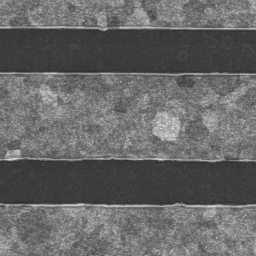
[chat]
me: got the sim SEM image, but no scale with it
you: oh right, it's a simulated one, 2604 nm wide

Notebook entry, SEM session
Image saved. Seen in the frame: one or a few lines or trenches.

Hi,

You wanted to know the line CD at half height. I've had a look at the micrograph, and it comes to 871 nanometres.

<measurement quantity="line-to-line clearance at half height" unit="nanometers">469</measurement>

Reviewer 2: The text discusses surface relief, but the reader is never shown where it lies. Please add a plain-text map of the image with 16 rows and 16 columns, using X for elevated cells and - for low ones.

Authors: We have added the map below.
XXXXXXXXXXXXXXXX
XXXXXXXXXXXXXXXX
----------------
----------------
----------------
XXXXXXXXXXXXXXXX
XXXXXXXXXXXXXXXX
XXXXXXXXXXXXXXXX
XXXXXXXXXXXXXXXX
XXXXXXXXXXXXXXXX
----------------
----------------
----------------
XXXXXXXXXXXXXXXX
XXXXXXXXXXXXXXXX
XXXXXXXXXXXXXXXX